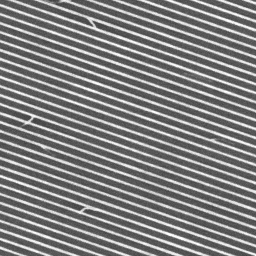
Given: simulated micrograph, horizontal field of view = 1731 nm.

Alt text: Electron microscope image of parallel lines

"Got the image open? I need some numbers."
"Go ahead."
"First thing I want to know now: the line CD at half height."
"17.6 nanometers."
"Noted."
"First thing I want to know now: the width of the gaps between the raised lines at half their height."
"39.1 nm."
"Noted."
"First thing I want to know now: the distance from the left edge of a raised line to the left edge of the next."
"57.5 nm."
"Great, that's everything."